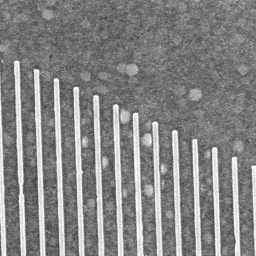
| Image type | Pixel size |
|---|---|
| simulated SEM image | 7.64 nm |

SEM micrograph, parallel lines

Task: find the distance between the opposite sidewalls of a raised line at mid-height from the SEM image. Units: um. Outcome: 0.0353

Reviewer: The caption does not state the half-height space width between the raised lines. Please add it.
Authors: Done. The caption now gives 0.114 micrometres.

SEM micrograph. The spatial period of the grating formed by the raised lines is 0.149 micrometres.